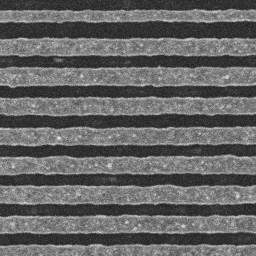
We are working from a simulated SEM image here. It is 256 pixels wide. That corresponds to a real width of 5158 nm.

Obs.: parallel lines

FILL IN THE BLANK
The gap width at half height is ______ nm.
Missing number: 254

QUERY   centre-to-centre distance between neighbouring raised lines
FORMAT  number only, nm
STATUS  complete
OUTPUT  600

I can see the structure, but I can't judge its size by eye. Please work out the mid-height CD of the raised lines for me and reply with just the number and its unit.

332 nm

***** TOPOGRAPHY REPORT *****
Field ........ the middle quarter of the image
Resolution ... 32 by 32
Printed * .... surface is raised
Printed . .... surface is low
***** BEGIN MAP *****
................................
********************************
********************************
********************************
********************************
.......................*........
................................
................................
*..******...........***....**.*.
********************************
********************************
********************************
*******************............*
................................
................................
................................
********************************
********************************
********************************
********************************
................................
................................
................................
***..*************..***********.
********************************
********************************
********************************
**..........**...******..**.....
................................
................................
*****....*..*...**.....*****....
********************************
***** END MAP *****